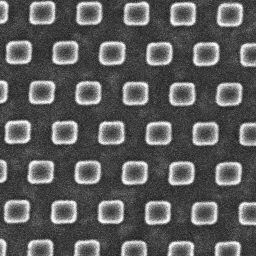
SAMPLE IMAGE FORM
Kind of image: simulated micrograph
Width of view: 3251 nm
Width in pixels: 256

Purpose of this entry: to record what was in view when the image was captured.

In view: a regular array of raised bodies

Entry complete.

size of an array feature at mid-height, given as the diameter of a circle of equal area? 315 nanometers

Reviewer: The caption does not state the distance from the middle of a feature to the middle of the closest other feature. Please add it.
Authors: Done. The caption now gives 583 nanometers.